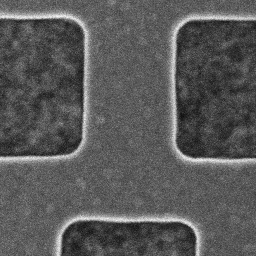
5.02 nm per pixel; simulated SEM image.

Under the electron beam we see holes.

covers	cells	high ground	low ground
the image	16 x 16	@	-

@@@@@@@@@@@@@@@@
-----@@@@@@@----
-----@@@@@@-----
-----@@@@@@-----
-----@@@@@@-----
-----@@@@@@-----
-----@@@@@@-----
-----@@@@@@-----
-----@@@@@@-----
-----@@@@@@-----
@@@@@@@@@@@@@@@@
@@@@@@@@@@@@@@@@
@@@@@@@@@@@@@@@@
@@@@@@@@@@@@@@@@
@@@@--------@@@@
@@@@--------@@@@